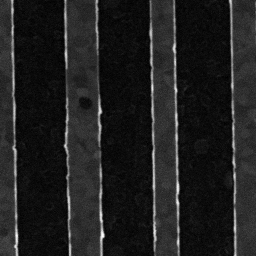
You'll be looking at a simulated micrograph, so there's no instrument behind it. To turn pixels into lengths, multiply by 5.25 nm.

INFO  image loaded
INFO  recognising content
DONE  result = one or a few lines or trenches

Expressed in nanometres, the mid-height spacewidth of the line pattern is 268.